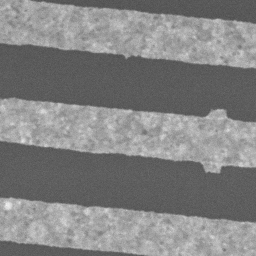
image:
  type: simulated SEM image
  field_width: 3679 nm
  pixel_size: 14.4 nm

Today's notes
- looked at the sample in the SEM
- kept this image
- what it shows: one or a few lines or trenches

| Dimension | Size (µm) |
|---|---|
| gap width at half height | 0.792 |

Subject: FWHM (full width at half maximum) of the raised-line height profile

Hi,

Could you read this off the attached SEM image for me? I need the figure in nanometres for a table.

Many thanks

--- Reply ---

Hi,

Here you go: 616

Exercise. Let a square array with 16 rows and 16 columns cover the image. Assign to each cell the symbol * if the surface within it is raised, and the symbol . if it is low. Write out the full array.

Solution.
******..........
****************
****************
.........*******
................
................
****............
**************..
****************
......**.*******
.............*..
................
**..............
***********.....
****************
.....***********